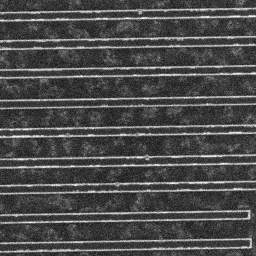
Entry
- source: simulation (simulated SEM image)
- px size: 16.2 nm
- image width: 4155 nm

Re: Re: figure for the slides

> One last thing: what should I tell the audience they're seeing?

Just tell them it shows parallel lines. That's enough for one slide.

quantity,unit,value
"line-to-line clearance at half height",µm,0.325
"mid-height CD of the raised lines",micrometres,0.134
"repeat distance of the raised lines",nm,468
